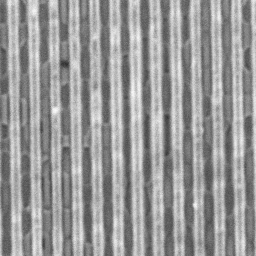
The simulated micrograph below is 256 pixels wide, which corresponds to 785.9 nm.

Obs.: parallel lines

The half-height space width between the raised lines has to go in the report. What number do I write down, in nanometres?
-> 35.3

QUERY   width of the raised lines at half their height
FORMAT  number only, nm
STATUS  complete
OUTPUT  26.8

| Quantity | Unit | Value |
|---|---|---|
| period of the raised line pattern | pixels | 20.3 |